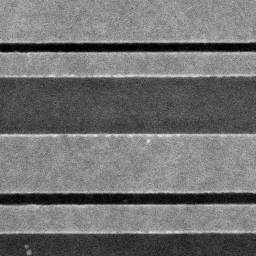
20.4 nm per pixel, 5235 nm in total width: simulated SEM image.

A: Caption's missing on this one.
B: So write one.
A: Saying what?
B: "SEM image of lines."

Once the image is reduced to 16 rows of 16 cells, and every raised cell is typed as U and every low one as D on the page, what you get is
UUUUUUUUUUUUUUUU
UUUUUUUUUUUUUUUU
UUUUUUUUUUUUUUUU
UUUUUUUUUUUUUUUU
UUUUUUUUUUUUUUUU
DDDDDDDDDDDDDDDD
DDDDDDDDDDDDDDDD
DDDDDDDDDDDDDDDD
UUUUUUUUUUUUUUUU
UUUUUUUUUUUUUUUU
UUUUUUUUUUUUUUUU
UUUUUUUUUUUUUUUU
UUUUUUUUUUUUUUUU
UUUUUUUUUUUUUUUU
UUUUUUUUUUUUDDDD
DDDDDDDDDDDDDDDD